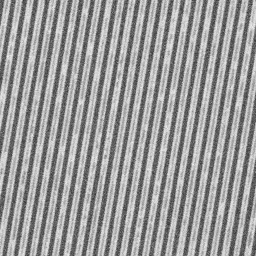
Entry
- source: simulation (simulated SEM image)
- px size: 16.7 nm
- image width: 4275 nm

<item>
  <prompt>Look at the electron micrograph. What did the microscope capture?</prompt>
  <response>parallel lines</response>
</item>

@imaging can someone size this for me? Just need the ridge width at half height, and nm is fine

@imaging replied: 76.1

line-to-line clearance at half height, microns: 0.121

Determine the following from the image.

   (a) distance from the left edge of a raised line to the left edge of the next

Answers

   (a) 186 nanometres